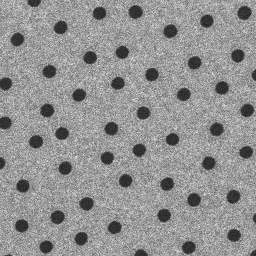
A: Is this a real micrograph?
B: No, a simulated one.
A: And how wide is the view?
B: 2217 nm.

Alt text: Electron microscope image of a regular array of holes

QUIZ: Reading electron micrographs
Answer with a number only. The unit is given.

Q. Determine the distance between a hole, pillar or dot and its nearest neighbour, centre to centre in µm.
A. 0.296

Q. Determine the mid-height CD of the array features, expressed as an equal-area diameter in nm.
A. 118